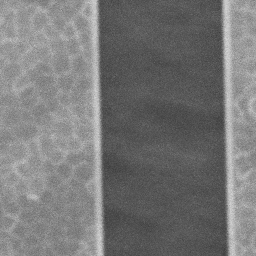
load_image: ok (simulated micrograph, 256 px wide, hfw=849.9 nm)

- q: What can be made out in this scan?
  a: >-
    one or a few lines or trenches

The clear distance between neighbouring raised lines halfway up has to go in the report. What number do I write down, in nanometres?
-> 435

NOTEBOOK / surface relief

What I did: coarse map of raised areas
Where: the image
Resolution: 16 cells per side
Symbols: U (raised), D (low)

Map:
UUUUUUDDDDDDDDUU
UUUUUUDDDDDDDDUU
UUUUUUDDDDDDDDUU
UUUUUUDDDDDDDDUU
UUUUUUDDDDDDDDUU
UUUUUUDDDDDDDDUU
UUUUUUDDDDDDDDUU
UUUUUUDDDDDDDDUU
UUUUUUDDDDDDDDUU
UUUUUUDDDDDDDDUU
UUUUUUDDDDDDDDUU
UUUUUUDDDDDDDDUU
UUUUUUDDDDDDDDUU
UUUUUUDDDDDDDDUU
UUUUUUDDDDDDDDUU
UUUUUUDDDDDDDDUU